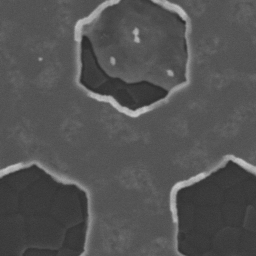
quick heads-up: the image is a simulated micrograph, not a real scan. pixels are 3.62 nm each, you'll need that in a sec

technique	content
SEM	holes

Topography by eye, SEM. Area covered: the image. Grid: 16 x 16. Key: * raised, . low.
*******...******
*****.......****
*****...**..****
*****.......****
*****.......****
*****......*****
********.*******
****************
****************
****************
**************.*
....********....
.....******.....
.....******.....
.....******.....
.....******.....